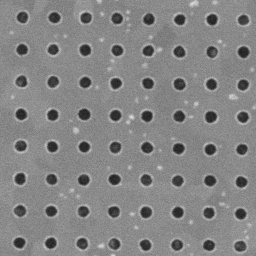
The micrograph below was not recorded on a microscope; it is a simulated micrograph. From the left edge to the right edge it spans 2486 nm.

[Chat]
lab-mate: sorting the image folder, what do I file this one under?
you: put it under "a regular array of holes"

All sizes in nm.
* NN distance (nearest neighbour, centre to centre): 305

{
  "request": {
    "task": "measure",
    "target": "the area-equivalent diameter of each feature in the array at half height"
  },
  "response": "123 nm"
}